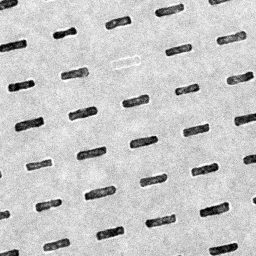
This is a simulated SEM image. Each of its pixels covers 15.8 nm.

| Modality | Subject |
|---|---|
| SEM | a regular array of holes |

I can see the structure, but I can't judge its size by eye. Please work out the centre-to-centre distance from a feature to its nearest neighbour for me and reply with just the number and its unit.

638 nm